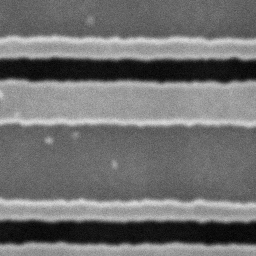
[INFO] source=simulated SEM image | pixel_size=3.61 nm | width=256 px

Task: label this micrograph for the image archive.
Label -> lines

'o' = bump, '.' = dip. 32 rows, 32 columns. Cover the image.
................................
................................
................................
................................
................................
oooooooooooooooooooooooooooooooo
oooooooooooooooooooooooooooooooo
................................
................................
................................
oooooooooooooooooooo.ooooooo.ooo
oooooooooooooooooooooooooooooooo
oooooooooooooooooooooooooooooooo
oooooooooooooooooooooooooooooooo
oooooooooooooooooooooooooooooooo
.................o.....o.....ooo
................................
................................
................................
................................
................................
................................
................................
................................
................................
oooooooooooooooooooooooooooooo.o
oooooooooooooooooooooooooooooooo
.....ooo.o..oooooo.oo.o.oooooooo
................................
................................
...oo..o........................
oooooooooooooooooooooooooooooooo